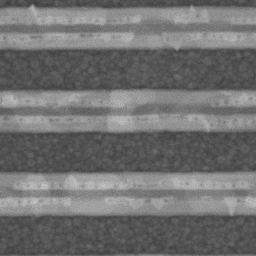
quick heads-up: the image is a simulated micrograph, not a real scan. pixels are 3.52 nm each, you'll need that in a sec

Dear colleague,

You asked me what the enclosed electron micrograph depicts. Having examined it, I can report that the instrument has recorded one or a few lines or trenches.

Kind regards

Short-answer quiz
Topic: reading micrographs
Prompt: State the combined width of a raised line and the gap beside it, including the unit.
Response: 0.291 um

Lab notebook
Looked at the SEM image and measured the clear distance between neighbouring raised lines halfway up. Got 195 nm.